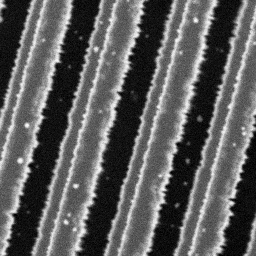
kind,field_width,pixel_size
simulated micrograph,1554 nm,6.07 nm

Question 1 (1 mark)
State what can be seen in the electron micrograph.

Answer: lines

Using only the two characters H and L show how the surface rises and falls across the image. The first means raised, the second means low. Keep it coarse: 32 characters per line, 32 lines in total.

LLLLHHHHHLLLLHHHHHLLLLHHHHHLLLLH
LLLLHHHHHLLLHHHHHHLLLLHHHHLLLLHH
LLLHHHHHLLLLHHHHHLLLLHHHHHLLLLHH
LLLHHHHHLLLLHHHHHLLLLHHHHHLLLLHH
LLLHHHHHLLLHHHHHHLLLLHHHHHLLLHHH
LLLHHHHHLLLHHHHHHLLLHHHHHHLLLHHH
LLHHHHHLLLLHHHHHLLLLHHHHHLLLLHHH
LLHHHHHLLLLHHHHHLLLLHHHHHLLLLHHH
LLHHHHHLLLHHHHHHLLLLHHHHHLLLHHHH
LLHHHHLLLLHHHHHLLLLHHHHHHLLLHHHH
LHHHHHLLLLHHHHHLLLLHHHHHLLLLHHHH
LHHHHHLLLLHHHHHLLLLHHHHHLLLLHHHH
LHHHHHLLLHHHHHHLLLHHHHHHLLLHHHHH
LHHHHLLLLHHHHHLLLLHHHHHLLLLHHHHH
HHHHHLLLLHHHHHLLLLHHHHHLLLLHHHHH
HHHHHLLLLHHHHHLLLLHHHHHLLLHHHHHH
HHHHHLLLHHHHHLLLLHHHHHHLLLHHHHHH
HHHHHLLLHHHHHLLLLHHHHHLLLLHHHHHL
HHHHLLLLHHHHHLLLLHHHHHLLLLHHHHHL
HHHHLLLHHHHHHLLLLHHHHHLLLHHHHHHL
HHHHLLLHHHHHLLLLHHHHHLLLLHHHHHLL
HHHHLLLHHHHHLLLLHHHHHLLLLHHHHHLL
HHHLLLLHHHHHLLLLHHHHHLLLHHHHHHLL
HHHLLLHHHHHHLLLHHHHHHLLLHHHHHLLL
HHLLLLHHHHHHLLLHHHHHLLLLHHHHHLLL
HHLLLLHHHHHLLLLHHHHHLLLLHHHHHLLL
HHLLLLHHHHHLLLLHHHHHLLLHHHHHHLLL
HHLLLHHHHHLLLLHHHHHHLLLHHHHHHLLL
HLLLLHHHHHLLLLHHHHHLLLLHHHHHLLLL
HLLLLHHHHHLLLLHHHHHLLLLHHHHHLLLL
HLLLLHHHHHLLLLHHHHHLLLHHHHHHLLLH
HLLLHHHHHLLLLHHHHHLLLLHHHHHLLLLH